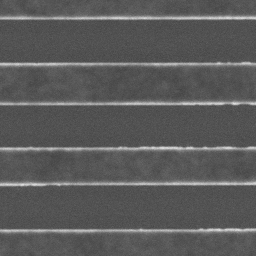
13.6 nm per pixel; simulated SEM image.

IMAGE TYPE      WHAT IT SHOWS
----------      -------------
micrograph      lines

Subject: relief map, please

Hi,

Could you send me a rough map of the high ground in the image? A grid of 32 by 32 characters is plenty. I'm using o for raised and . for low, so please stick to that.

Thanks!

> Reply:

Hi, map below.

oooooooooooooooooooooooooooooooo
oooooooooooooooooooooooooooooooo
................................
................................
................................
................................
................................
................................
oooooooooooooooooooooooooooooooo
oooooooooooooooooooooooooooooooo
oooooooooooooooooooooooooooooooo
oooooooooooooooooooooooooooooooo
oooooooooooooooooooooooooooooooo
................................
................................
................................
................................
................................
...............o.ooooooo.o.oo..o
oooooooooooooooooooooooooooooooo
oooooooooooooooooooooooooooooooo
oooooooooooooooooooooooooooooooo
oooooooooooooooooooooooooooooooo
................................
................................
................................
................................
................................
................................
oooooooooooooooooooooooooooooooo
oooooooooooooooooooooooooooooooo
oooooooooooooooooooooooooooooooo